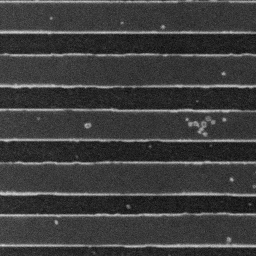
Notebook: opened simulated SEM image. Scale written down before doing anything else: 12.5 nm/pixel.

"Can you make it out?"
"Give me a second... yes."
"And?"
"lines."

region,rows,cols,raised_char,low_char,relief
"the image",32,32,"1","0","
11111111111111111111111111111111
11111111111111111111111111111111
11111111111111111111111111111111
11111111111111111111111111111111
00000000000000000000000000000000
00000000000000000000000000000000
00000000000000000000000000000000
11111111111111111111111111111111
11111111111111111111111111111111
11111111111111111111111111111111
11111111111111111111111111111111
00000000000000000000000000000000
00000000000000000000000000000000
00000000000000000000000000000000
11111111111111111111111111111111
11111111111111111111111111111111
11111111111111111111111111111111
11111111111111111111111111111111
00000000000000000000000000000000
00000000000000000000000000000000
11111111111111111111111111111111
11111111111111111111111111111111
11111111111111111111111111111111
11111111111111111111111111111111
00000000000000000000000000000000
00000000000000000000000000000000
00000000000000000000000000000000
11111111111111111111111111111111
11111111111111111111111111111111
11111111111111111111111111111111
11111111111111111111111111111111
00000000000000000000000000000000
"